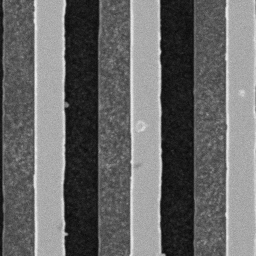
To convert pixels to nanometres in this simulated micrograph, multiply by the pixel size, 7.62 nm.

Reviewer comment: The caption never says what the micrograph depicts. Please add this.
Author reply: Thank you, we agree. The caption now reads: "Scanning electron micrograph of lines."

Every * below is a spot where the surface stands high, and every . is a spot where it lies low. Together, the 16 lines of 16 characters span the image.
****..****..****
****..****..****
****..****..****
****..****..****
****..****..****
****..****..****
****..****..****
****..****..****
****..****..****
****..****..****
****..****..****
****..****..****
****..****..****
****..****..****
****..****..****
****..****..****